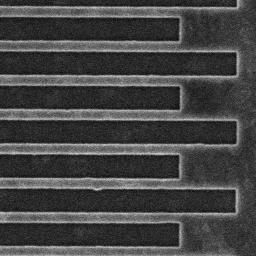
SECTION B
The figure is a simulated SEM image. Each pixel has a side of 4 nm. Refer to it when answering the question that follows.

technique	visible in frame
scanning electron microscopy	parallel lines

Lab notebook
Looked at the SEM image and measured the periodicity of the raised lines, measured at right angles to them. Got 137 nm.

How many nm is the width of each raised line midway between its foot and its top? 41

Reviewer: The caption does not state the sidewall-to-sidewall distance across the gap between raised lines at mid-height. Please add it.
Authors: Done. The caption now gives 0.0965 um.